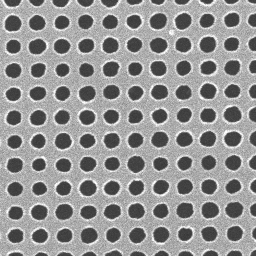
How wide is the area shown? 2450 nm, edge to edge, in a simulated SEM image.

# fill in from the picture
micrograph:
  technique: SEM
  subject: a regular array of holes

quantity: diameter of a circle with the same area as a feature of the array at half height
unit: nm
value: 144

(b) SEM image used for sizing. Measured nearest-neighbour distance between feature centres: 0.223 um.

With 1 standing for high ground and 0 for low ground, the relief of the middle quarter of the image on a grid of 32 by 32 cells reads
01110001110000110001110000110000
01110001110000110001110000110000
01110001110001110001110001111001
11111111111111111111111111111111
11111111111111111111111111111111
11111111111001111111111001111001
01110000110000110000110000110000
00110000110000110000110000110000
01110001111001111001110001111001
11111111111111111111111111111111
11111111111111111111111111111111
11111111111011111111111001111001
01110001110000110001110000110000
01110000110000110000110000110000
01110001111001110001111001111001
11111111111111111111111111111111
11111111111111111111111111111111
01111001111001111001111000111001
00110000110000110000110000110000
00110000110000110000110000110000
01110001111001110001111001111011
11111111111111111111111111111111
11111111111111111111111111111111
11111001111001110001111001111000
01110000110000110000110000110000
00110000110000110000110000110000
01111001111001111001111011111001
11111111111111111111111111111111
11111111111111111111111111111111
01111001111001111000111000111000
00110000110000110000110000110000
00110000110000110000110000111000